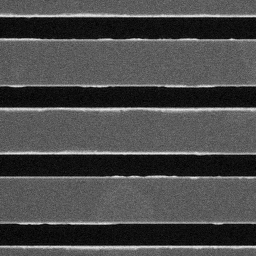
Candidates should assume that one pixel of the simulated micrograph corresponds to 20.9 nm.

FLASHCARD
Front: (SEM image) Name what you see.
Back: lines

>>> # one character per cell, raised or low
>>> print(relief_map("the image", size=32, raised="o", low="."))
oooooooooooooooooooooooooooooooo
oooooooooooooooooooooooooooooooo
................................
................................
................................
oooooooooooooooooooooooooooooooo
oooooooooooooooooooooooooooooooo
oooooooooooooooooooooooooooooooo
oooooooooooooooooooooooooooooooo
oooooooooooooooooooooooooooooooo
oooooooooooooooooooooooooooooooo
................................
................................
................................
oooooooooooooooooooooooooooooooo
oooooooooooooooooooooooooooooooo
oooooooooooooooooooooooooooooooo
oooooooooooooooooooooooooooooooo
oooooooooooooooooooooooooooooooo
................................
................................
................................
oooooooooooooooooooooooooooooooo
oooooooooooooooooooooooooooooooo
oooooooooooooooooooooooooooooooo
oooooooooooooooooooooooooooooooo
oooooooooooooooooooooooooooooooo
oooooooooooooooooooooooooooooooo
................................
................................
................................
oooooooooooooooooooooooooooooooo